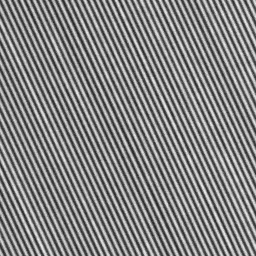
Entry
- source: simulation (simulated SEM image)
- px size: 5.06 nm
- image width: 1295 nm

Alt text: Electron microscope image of parallel lines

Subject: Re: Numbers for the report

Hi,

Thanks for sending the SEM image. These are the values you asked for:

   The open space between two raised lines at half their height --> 17.3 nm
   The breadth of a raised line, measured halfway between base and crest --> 8.6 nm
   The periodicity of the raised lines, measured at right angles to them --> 28.9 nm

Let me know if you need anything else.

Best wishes